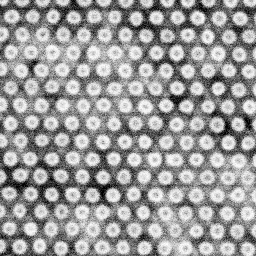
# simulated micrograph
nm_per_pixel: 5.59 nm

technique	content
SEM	a regular array of raised bodies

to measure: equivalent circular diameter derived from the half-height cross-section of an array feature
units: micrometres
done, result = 0.0669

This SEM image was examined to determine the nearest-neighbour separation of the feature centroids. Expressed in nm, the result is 110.